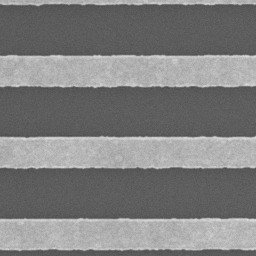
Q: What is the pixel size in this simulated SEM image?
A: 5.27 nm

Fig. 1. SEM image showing lines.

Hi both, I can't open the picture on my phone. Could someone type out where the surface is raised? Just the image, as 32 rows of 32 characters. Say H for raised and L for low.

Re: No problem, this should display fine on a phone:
HHHHHHLLHLHHHHHLHHLHHLLHHHHLLHHH
LLLLLLLLLLLLLLLLLLLLLLLLLLLLLLLL
LLLLLLLLLLLLLLLLLLLLLLLLLLLLLLLL
LLLLLLLLLLLLLLLLLLLLLLLLLLLLLLLL
LLLLLLLLLLLLLLLLLLLLLLLLLLLLLLLL
LLLLLLLLLLLLLLLLLLLLLLLLLLLLLLLL
LLLLLLLLLLLLLLLLLLLLLLLLLLLLLLLL
HHHHHHHHHHHHHHHHHHHHHHHHHHHHHHHH
HHHHHHHHHHHHHHHHHHHHHHHHHHHHHHHH
HHHHHHHHHHHHHHHHHHHHHHHHHHHHHHHH
HHHHHHHHHHHHHHHHHHHHHHHHHHHHHHHH
LLLLLLLLLLLLLLLLLLLLLLLLLLLLLLLL
LLLLLLLLLLLLLLLLLLLLLLLLLLLLLLLL
LLLLLLLLLLLLLLLLLLLLLLLLLLLLLLLL
LLLLLLLLLLLLLLLLLLLLLLLLLLLLLLLL
LLLLLLLLLLLLLLLLLLLLLLLLLLLLLLLL
LLLLLLLLLLLLLLLLLLLLLLLLLLLLLLLL
HHHHHHHHHHHHHHHHHHHHHHHHHHHHHHHH
HHHHHHHHHHHHHHHHHHHHHHHHHHHHHHHH
HHHHHHHHHHHHHHHHHHHHHHHHHHHHHHHH
HHHHHHHHHHHHHHHHHHHHHHHHHHHHHHHH
LLLLLLLLLLLLLLLLLLLLLLLLLLLLLLLL
LLLLLLLLLLLLLLLLLLLLLLLLLLLLLLLL
LLLLLLLLLLLLLLLLLLLLLLLLLLLLLLLL
LLLLLLLLLLLLLLLLLLLLLLLLLLLLLLLL
LLLLLLLLLLLLLLLLLLLLLLLLLLLLLLLL
LLLLLLLLLLLLLLLLLLLLLLLLLLLLLLLL
HHHHHHHHHHHHHHHHHHHHHHHHHHHHHHHH
HHHHHHHHHHHHHHHHHHHHHHHHHHHHHHHH
HHHHHHHHHHHHHHHHHHHHHHHHHHHHHHHH
HHHHHHHHHHHHHHHHHHHHHHHHHHHHHHHH
LLLLLLLLLLLLLLLLLLLLLLLLLLLLLLLL